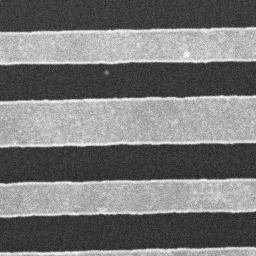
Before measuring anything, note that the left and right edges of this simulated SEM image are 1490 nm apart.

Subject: lines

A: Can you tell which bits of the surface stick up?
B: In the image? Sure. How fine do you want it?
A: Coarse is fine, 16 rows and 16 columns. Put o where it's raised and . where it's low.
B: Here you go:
................
................
oooooooooooooooo
oooooooooooooooo
................
................
oooooooooooooooo
oooooooooooooooo
oooooooooooooooo
................
................
oooooooooooooooo
oooooooooooooooo
o...............
................
................